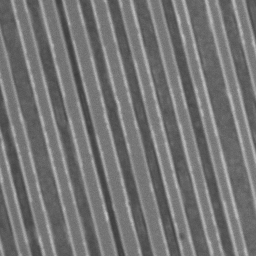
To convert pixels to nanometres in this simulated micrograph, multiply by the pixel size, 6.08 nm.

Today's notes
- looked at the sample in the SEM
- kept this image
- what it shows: parallel lines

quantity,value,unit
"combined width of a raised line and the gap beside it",162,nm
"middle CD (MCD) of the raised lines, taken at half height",82.6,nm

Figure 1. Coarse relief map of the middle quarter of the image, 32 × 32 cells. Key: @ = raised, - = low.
@@--@@@@---@@@@---@@@----@@@---@
@@--@@@@---@@@@---@@@----@@@@--@
@@--@@@@---@@@@---@@@@----@@@---
@@--@@@@----@@@---@@@@----@@@---
@@@--@@@@---@@@@---@@@----@@@---
@@@--@@@@---@@@@---@@@----@@@---
@@@--@@@@---@@@@---@@@@----@@@--
@@@--@@@@----@@@---@@@@----@@@--
@@@@--@@@@---@@@@---@@@----@@@--
@@@@--@@@@---@@@@---@@@----@@@--
@@@@--@@@@---@@@@---@@@@----@@@-
-@@@--@@@@----@@@---@@@@----@@@-
-@@@@--@@@@---@@@@---@@@----@@@-
-@@@@--@@@@---@@@@---@@@----@@@-
-@@@@--@@@@---@@@@---@@@@----@@@
--@@@--@@@@----@@@---@@@@----@@@
--@@@@--@@@@---@@@@---@@@----@@@
--@@@@--@@@@---@@@@---@@@----@@@
--@@@@--@@@@---@@@@---@@@@----@@
---@@@--@@@@---@@@@---@@@@----@@
---@@@@--@@@@---@@@@---@@@----@@
---@@@@--@@@@---@@@@---@@@----@@
---@@@@--@@@@---@@@@---@@@@----@
----@@@--@@@@---@@@@---@@@@----@
----@@@@--@@@@---@@@@---@@@----@
----@@@@--@@@@---@@@@---@@@----@
@---@@@@--@@@@---@@@@---@@@@----
@----@@@--@@@@---@@@@---@@@@----
@----@@@@--@@@@---@@@----@@@----
@@---@@@@--@@@@---@@@@---@@@----
@@---@@@@--@@@@---@@@@---@@@@---
@@---@@@@--@@@@---@@@@---@@@@---